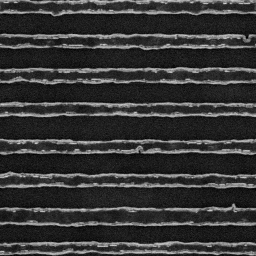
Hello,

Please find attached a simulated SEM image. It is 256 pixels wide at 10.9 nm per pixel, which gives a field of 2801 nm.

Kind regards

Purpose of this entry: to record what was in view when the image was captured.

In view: parallel lines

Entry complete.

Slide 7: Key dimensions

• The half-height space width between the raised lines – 248 nanometers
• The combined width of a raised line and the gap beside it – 377 nm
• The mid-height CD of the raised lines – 0.133 microns